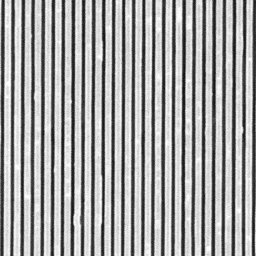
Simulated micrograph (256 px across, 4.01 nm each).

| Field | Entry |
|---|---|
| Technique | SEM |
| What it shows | parallel lines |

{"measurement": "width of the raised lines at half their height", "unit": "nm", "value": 22.6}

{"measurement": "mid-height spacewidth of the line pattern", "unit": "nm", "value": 15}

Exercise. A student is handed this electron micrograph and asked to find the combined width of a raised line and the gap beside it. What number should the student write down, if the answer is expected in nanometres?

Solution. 40.4